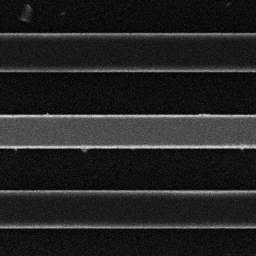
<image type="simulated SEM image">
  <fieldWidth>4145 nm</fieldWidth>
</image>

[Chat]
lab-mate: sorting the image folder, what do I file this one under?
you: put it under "lines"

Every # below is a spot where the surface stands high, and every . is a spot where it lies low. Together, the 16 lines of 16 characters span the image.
................
................
################
################
................
................
................
################
################
................
................
................
################
################
................
................